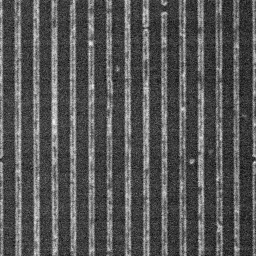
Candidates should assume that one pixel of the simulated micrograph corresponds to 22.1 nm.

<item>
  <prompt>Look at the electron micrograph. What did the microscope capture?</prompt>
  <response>parallel lines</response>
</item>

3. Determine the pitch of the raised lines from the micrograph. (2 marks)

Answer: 18.2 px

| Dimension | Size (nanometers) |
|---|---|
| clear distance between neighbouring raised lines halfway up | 296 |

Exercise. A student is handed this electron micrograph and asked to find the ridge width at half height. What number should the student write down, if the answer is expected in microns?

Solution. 0.0997